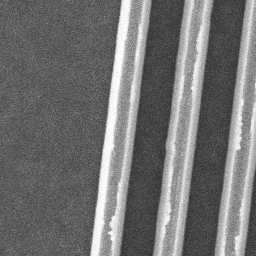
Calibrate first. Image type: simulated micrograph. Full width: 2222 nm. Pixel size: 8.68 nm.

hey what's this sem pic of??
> one or a few lines or trenches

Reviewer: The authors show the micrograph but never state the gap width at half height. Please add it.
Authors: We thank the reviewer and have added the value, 357 nm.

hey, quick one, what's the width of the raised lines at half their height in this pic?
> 179 nm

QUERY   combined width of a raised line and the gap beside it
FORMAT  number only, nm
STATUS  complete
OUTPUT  535